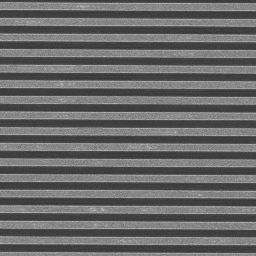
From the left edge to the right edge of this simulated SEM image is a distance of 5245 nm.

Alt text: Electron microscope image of parallel lines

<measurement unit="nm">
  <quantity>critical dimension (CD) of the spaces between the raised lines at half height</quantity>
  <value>136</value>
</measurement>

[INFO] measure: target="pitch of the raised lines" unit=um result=0.32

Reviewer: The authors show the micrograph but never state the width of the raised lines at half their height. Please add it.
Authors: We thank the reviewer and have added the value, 172 nm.